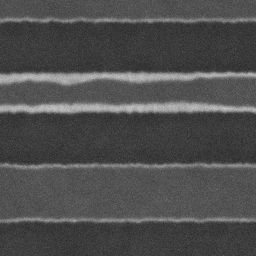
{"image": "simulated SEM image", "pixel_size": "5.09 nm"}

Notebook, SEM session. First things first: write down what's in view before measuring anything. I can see lines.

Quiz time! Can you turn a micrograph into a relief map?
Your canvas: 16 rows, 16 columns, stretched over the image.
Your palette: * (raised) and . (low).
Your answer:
****************
................
................
................
................
****************
****************
................
................
................
****************
****************
****************
****************
................
................